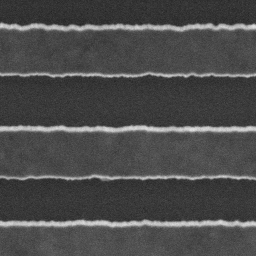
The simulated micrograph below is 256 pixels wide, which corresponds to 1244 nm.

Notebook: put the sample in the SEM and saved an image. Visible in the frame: lines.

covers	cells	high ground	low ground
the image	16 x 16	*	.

................
................
****************
****************
****************
................
................
................
****************
****************
****************
................
................
................
****************
****************